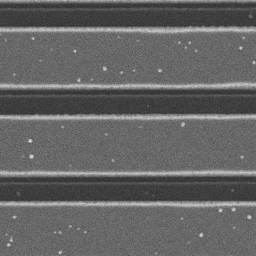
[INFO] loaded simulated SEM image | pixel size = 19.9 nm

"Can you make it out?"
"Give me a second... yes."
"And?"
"lines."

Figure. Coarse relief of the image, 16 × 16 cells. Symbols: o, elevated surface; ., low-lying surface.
................
................
oooooooooooooooo
oooooooooooooooo
oooooooooooooooo
................
................
oooooooooooooooo
oooooooooooooooo
oooooooooooooooo
oooooooooooooooo
................
................
oooooooooooooooo
oooooooooooooooo
oooooooooooooooo